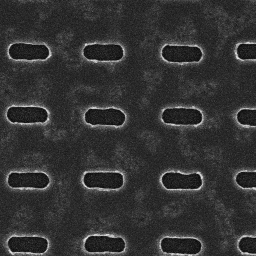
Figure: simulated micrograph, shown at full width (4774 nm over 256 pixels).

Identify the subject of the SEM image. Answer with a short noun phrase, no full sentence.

a regular array of holes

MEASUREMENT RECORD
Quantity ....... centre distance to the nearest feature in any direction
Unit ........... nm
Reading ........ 1190